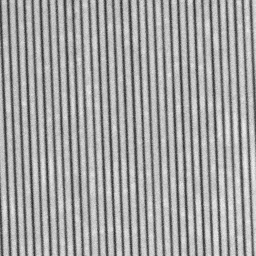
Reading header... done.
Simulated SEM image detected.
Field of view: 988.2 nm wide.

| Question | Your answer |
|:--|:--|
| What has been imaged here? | parallel lines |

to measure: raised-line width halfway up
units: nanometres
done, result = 23.1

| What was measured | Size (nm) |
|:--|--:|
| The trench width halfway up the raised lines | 6.7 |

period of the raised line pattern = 0.0312 um